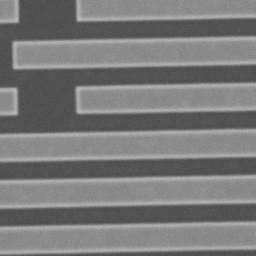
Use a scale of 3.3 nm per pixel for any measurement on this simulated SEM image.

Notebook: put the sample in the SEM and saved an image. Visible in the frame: parallel lines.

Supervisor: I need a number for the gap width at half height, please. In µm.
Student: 0.0653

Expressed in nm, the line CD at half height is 88.4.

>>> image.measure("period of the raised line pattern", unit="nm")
153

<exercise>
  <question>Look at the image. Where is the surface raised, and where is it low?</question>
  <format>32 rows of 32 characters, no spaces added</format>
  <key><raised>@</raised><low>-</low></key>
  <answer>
@@--------@@@@@@@@@@@@@@@@@@@@@@
@@--------@@@@@@@@@@@@@@@@@@@@@@
@@--------@@@@------------------
--------------------------------
--------------------------------
--@@@@@@@@@@@@@@@@@@@@@@@@@@@@@@
--@@@@@@@@@@@@@@@@@@@@@@@@@@@@@@
--@@@@@@@@@@@@@@@@@@@@@@@@@@@@@@
--@@@@--------------------------
--------------------------------
------------------------------@@
@@--------@@@@@@@@@@@@@@@@@@@@@@
@@--------@@@@@@@@@@@@@@@@@@@@@@
@@--------@@@@@@@@@@@@@@@@@@@@@@
--------------------------------
--------------------------------
--------------------@@@@@@@@@@@@
@@@@@@@@@@@@@@@@@@@@@@@@@@@@@@@@
@@@@@@@@@@@@@@@@@@@@@@@@@@@@@@@@
@@@@@@@@@@@@@@@@@@@@@@@@@@@@@@@@
--------------------------------
--------------------------------
------@-@@@@@@@@@@@@@@@@@@@@@@@@
@@@@@@@@@@@@@@@@@@@@@@@@@@@@@@@@
@@@@@@@@@@@@@@@@@@@@@@@@@@@@@@@@
@@@@@@@@@@@@@@@@@@--------------
--------------------------------
--------------------------------
@@@@@@@@@@@@@@@@@@@@@@@@@@@@@@@@
@@@@@@@@@@@@@@@@@@@@@@@@@@@@@@@@
@@@@@@@@@@@@@@@@@@@@@@@@@@@@@@@@
@@@@@@@@@-----------------------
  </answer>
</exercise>